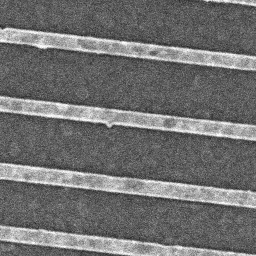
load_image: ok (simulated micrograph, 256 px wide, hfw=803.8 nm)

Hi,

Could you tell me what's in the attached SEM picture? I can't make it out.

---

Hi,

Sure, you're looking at one or a few lines or trenches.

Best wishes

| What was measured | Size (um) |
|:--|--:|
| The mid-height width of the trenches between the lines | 0.167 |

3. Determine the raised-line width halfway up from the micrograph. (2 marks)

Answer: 41.6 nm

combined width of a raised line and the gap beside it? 66.5 px